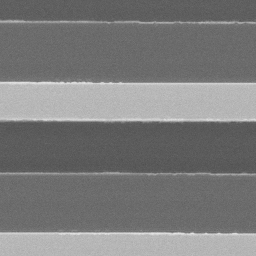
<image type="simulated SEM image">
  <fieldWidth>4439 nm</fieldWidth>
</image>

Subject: lines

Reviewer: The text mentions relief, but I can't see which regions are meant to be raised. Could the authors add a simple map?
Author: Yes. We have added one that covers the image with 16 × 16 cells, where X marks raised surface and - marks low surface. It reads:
----------------
XXXXXXXXXXXXXXXX
XXXXXXXXXXXXXXXX
XXXXXXXXXXXXXXXX
XXXXXXXXXXXXXXXX
XXXXXXXXXXXXXXXX
XXXXXXXXXXXXXXXX
XXXXXXXXXXXXXXXX
----------------
----------------
----------------
XXXXXXXXXXXXXXXX
XXXXXXXXXXXXXXXX
XXXXXXXXXXXXXXXX
XXXXXXXXXXXXXXXX
XXXXXXXXXXXXXXXX